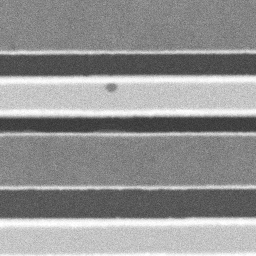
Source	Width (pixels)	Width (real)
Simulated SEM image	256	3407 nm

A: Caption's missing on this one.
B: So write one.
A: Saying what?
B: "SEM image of lines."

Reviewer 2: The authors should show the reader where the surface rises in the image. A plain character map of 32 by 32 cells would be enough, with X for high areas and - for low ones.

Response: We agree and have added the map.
XXXXXXXXXXXXXXXXXXXXXXXXXXXXXXXX
XXXXXXXXXXXXXXXXXXXXXXXXXXXXXXXX
XXXXXXXXXXXXXXXXXXXXXXXXXXXXXXXX
XXXXXXXXXXXXXXXXXXXXXXXXXXXXXXXX
XXXXXXXXXXXXXXXXXXXXXXXXXXXXXXXX
XXXXXXXXXXXXXXXXXXXXXXXXXXXXXXXX
XXXXXXXXXXXXXXXXXXXXXXXXXXXXXXXX
--------------------------------
--------------------------------
--------------------------------
XXXXXXXXXXXXXXXXXXXXXXXXXXXXXXXX
XXXXXXXXXXXXXXXXXXXXXXXXXXXXXXXX
XXXXXXXXXXXXXXXXXXXXXXXXXXXXXXXX
XXXXXXXXXXXXXXXXXXXXXXXXXXXXXXXX
XXXXXXXXXXXXXXXXX---------------
--------------------------------
--------------------------------
XXXXXXXXXXXXXXXXXXXXXXXXXXXXXXXX
XXXXXXXXXXXXXXXXXXXXXXXXXXXXXXXX
XXXXXXXXXXXXXXXXXXXXXXXXXXXXXXXX
XXXXXXXXXXXXXXXXXXXXXXXXXXXXXXXX
XXXXXXXXXXXXXXXXXXXXXXXXXXXXXXXX
XXXXXXXXXXXXXXXXXXXXXXXXXXXXXXXX
XXXXXXXXXXXXXXXXXXXXXXXXXXXXXXXX
--------------------------------
--------------------------------
--------------------------------
XXXXXXXXXXXXXXXXXXXXXXXXXXXXXXXX
XXXXXXXXXXXXXXXXXXXXXXXXXXXXXXXX
XXXXXXXXXXXXXXXXXXXXXXXXXXXXXXXX
XXXXXXXXXXXXXXXXXXXXXXXXXXXXXXXX
XXXXXXXXXXXXXXXXXXXXXXXXXXXXXXXX